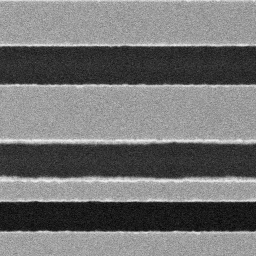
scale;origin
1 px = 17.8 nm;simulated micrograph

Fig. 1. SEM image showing lines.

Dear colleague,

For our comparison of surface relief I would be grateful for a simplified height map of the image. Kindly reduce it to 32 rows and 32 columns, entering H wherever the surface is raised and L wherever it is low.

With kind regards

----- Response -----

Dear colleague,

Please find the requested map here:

HHHHHHHHHHHHHHHHHHHHHHHHHHHHHHHH
HHHHHHHHHHHHHHHHHHHHHHHHHHHHHHHH
HHHHHHHHHHHHHHHHHHHHHHHHHHHHHHHH
HHHHHHHHHHHHHHHHHHHHHHHHHHHHHHHH
HHHHHHHHHHHHHHHHHHHHHHHHHHHHHHHH
HHHHHHHHHHHHHHHHHHHHHHHHHHHHHHHH
LLLLLLLLLLLLLLLLLLLLLLLLLLLLLLLL
LLLLLLLLLLLLLLLLLLLLLLLLLLLLLLLL
LLLLLLLLLLLLLLLLLLLLLLLLLLLLLLLL
LLLLLLLLLLLLLLLLLLLLLLLLLLLLLLLL
LLLLLLLLLLLLLLLLLLLLLLLLLLLLLLLL
HHHHHHHHHHHHHHHHHHHHHHHHHHHHHHHH
HHHHHHHHHHHHHHHHHHHHHHHHHHHHHHHH
HHHHHHHHHHHHHHHHHHHHHHHHHHHHHHHH
HHHHHHHHHHHHHHHHHHHHHHHHHHHHHHHH
HHHHHHHHHHHHHHHHHHHHHHHHHHHHHHHH
HHHHHHHHHHHHHHHHHHHHHHHHHHHHHHHH
HHHHHHHHHHHHHHHHHHHHHHHHHHHHHHHH
LLLLLLLLLLLLLLLLLLLLLLLLLLLLLLLL
LLLLLLLLLLLLLLLLLLLLLLLLLLLLLLLL
LLLLLLLLLLLLLLLLLLLLLLLLLLLLLLLL
LLLLLLLLLLLLLLLLLLLLLLLLLLLLLLLL
HLLLLLHLLLLLLLLLLLLLLLLLLLLLLLLL
HHHHHHHHHHHHHHHHHHHHHHHHHHHHHHHH
HHHHHHHHHHHHHHHHHHHHHHHHHHHHHHHH
LLLLLLLLLLLLLLLLLLLLLLLLLLLLLLLL
LLLLLLLLLLLLLLLLLLLLLLLLLLLLLLLL
LLLLLLLLLLLLLLLLLLLLLLLLLLLLLLLL
LLLLLLLLLLLLLLLLLLLLLLLLLLLLLLLL
HHHHHHHHHHHHHHHHHHHHHHHHHHHHHHHH
HHHHHHHHHHHHHHHHHHHHHHHHHHHHHHHH
HHHHHHHHHHHHHHHHHHHHHHHHHHHHHHHH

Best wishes